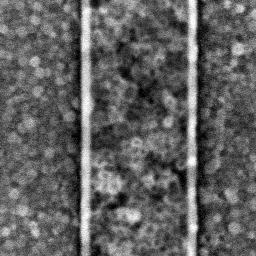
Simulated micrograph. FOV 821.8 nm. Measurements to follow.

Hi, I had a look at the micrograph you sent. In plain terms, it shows one or a few lines or trenches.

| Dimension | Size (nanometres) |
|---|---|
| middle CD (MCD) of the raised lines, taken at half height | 342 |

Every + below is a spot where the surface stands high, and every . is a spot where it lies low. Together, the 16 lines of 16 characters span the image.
.....+++++++....
.....+++++++....
.....+++++++....
.....+++++++....
.....+++++++....
.....+++++++....
.....+++++++....
.....+++++++....
.....+++++++....
.....+++++++....
.....+++++++....
.....+++++++....
.....+++++++....
.....+++++++....
.....+++++++....
.....+++++++....